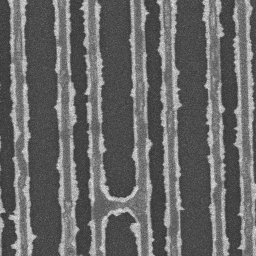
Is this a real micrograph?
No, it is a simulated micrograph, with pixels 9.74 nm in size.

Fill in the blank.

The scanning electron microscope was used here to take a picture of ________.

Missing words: parallel lines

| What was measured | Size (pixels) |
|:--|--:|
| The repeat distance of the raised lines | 37.7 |